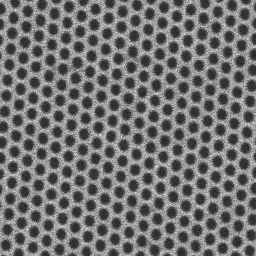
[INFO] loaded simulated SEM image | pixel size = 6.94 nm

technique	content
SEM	a regular array of holes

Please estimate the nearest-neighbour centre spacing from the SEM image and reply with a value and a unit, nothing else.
107 nm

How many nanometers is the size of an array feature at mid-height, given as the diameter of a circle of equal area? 74.7